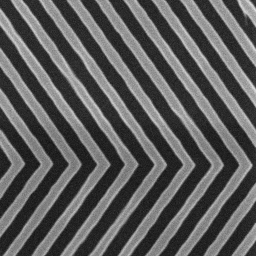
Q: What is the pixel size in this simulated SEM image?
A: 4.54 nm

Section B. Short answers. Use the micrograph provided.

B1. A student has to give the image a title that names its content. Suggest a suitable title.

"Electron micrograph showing groups of lines, slits or small figures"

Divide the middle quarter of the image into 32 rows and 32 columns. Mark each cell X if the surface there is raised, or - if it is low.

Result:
X-----XX----XXX----XXX-----XX---
XX----XXX----XXX----XXX----XXX--
XX-----XXX----XXX----XXX----XXX-
-XX-----XX-----XX-----XXX----XX-
--XX----XXX----XXX----XXX-----XX
--XXX----XXX----XXX----XXX----XX
---XX-----XXX----XXX----XXX----X
---XXX-----XX----XXX-----XX-----
----XXX----XXX----XXX----XXX----
-----XX-----XXX----XXX----XXX---
X-----XX-----XX-----XX----XXX---
XX----XXX----XXX----XXX----XXX--
XXX----XX-----XXX----XXX----XXX-
XXX-----XX----XXX-----XX-----XX-
-XXX----XXX----XXX----XXX-----XX
--XXX----XXX----XXX----XXX-----X
---XXX----XX-----XX-----XX-----X
---XXX-----XX-----XX-----XX-----
----XXX----XX-----XXX----XXX----
----XXXX----XX-----XXX----XXX---
X----XXX-----XX-----XX-----XX---
XX----XXX----XXX----XXX----XXX--
XXX----XXX----XXX----XXX----XXX-
XXX----XXX----XXX-----XX-----XX-
-XXX----XXX----XXX----XXX-----XX
-XXX----XXX----XXX-----XXX----XX
XXX-----XXX---XXXX----XXX----XXX
XXX----XXX----XXX----XXX----XXX-
XX----XXX----XXX----XXX----XXXX-
X-----XX----XXXX----XXX----XXX--
-----XXX----XXX----XXX----XXX---
----XXX----XXX----XXX----XXX----